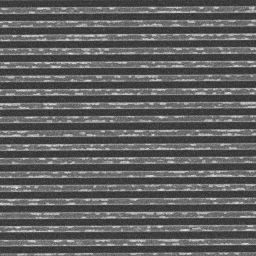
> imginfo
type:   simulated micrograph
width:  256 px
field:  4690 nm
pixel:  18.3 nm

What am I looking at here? parallel lines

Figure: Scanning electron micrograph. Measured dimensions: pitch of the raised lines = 250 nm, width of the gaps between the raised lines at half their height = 137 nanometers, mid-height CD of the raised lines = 103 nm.